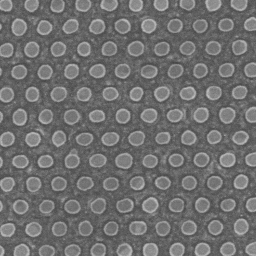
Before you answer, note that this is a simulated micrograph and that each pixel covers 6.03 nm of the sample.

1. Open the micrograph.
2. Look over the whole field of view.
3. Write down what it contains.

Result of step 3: a regular array of raised bodies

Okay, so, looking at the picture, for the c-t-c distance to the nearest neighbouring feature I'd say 153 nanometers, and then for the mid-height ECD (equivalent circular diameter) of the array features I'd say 0.0839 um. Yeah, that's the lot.